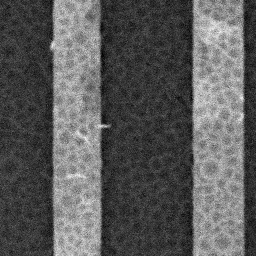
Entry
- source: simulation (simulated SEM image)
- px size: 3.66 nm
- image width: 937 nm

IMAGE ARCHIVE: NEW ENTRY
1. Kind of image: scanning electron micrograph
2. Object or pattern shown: one or a few lines or trenches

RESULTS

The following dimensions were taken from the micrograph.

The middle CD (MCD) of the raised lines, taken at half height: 177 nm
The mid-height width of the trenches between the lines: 340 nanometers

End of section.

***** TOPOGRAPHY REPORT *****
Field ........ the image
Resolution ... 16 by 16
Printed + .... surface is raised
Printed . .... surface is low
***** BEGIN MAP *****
...+++......+++.
...+++......+++.
...+++......+++.
...+++......+++.
...+++......+++.
...+++......+++.
...+++......+++.
...+++......+++.
...+++......+++.
...+++......+++.
+..+++......+++.
...+++......+++.
...+++......+++.
...+++......+++.
...+++......+++.
...+++......+++.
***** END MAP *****